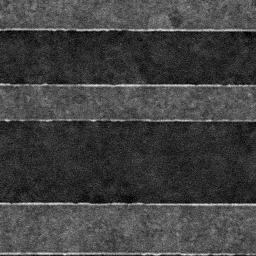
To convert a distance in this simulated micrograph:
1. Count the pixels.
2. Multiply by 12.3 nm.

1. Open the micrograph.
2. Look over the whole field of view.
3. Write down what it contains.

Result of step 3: lines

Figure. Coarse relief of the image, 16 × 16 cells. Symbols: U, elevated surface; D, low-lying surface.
UUUUUUUUUUUUUUUU
UUUUUUUUUUUUUUUU
DDDDDDDDDDDDDDDD
DDDDDDDDDDDDDDDD
DDDDDDDDDDDDDDDD
UUUUUUUUUUUUUUUU
UUUUUUUUUUUUUUUU
UUUUUUDUUUUUUUUU
DDDDDDDDDDDDDDDD
DDDDDDDDDDDDDDDD
DDDDDDDDDDDDDDDD
DDDDDDDDDDDDDDDD
DDDDDDDDDDDDDDDD
UUUUUUUUUUUUUUUU
UUUUUUUUUUUUUUUU
UUUUUUUUUUUUUUUU